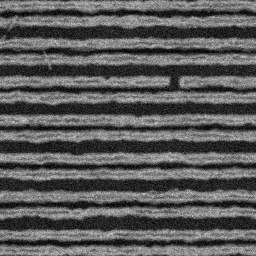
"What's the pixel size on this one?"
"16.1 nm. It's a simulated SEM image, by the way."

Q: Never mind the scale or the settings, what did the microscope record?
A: parallel lines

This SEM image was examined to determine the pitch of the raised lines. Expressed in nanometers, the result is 304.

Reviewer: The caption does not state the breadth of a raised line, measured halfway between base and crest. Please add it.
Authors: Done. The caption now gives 0.117 microns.